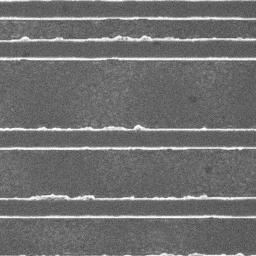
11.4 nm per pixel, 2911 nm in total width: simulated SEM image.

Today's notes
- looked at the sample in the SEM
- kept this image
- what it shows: lines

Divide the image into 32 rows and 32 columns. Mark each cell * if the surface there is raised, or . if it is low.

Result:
********************************
********************************
................................
................................
................................
********************************
********************************
................................
................................
................................
................................
................................
................................
................................
................................
................................
********************************
********************************
*************.**.****.*....***..
................................
................................
................................
................................
................................
......*.........................
********************************
********************************
................................
................................
................................
................................
................................